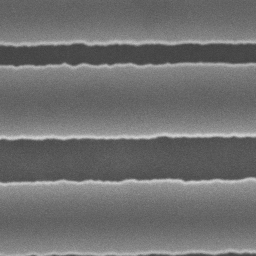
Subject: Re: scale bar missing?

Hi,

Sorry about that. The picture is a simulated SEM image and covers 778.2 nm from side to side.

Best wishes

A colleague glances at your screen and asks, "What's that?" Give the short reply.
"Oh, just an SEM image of lines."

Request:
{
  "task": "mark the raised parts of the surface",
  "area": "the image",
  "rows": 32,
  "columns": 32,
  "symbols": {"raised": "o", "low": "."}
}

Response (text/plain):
oooooooooooooooooooooooooooooooo
oooooooooooooooooooooooooooooooo
oooooooooooooooooooooooooooooooo
oooooooooooooooooooooooooooooooo
oooooooooooooooooooooooooooooooo
ooooooooo..ooo..oo...o..........
................................
................................
oooooooooooooooooooooooooooooooo
oooooooooooooooooooooooooooooooo
oooooooooooooooooooooooooooooooo
oooooooooooooooooooooooooooooooo
oooooooooooooooooooooooooooooooo
oooooooooooooooooooooooooooooooo
oooooooooooooooooooooooooooooooo
oooooooooooooooooooooooooooooooo
oooooooooooooooooooooooooooooooo
................................
................................
................................
................................
................................
................o..oooo...oo..oo
oooooooooooooooooooooooooooooooo
oooooooooooooooooooooooooooooooo
oooooooooooooooooooooooooooooooo
oooooooooooooooooooooooooooooooo
oooooooooooooooooooooooooooooooo
oooooooooooooooooooooooooooooooo
oooooooooooooooooooooooooooooooo
oooooooooooooooooooooooooooooooo
oooooooooooooooooooooooooooooooo